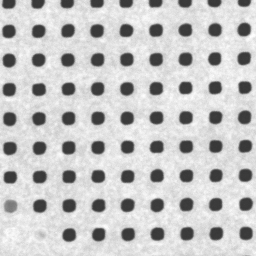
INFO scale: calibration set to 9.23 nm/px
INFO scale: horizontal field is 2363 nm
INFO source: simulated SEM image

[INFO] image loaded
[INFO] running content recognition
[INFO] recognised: a regular array of holes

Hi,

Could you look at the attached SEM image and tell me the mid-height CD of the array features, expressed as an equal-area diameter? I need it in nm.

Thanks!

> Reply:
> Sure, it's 129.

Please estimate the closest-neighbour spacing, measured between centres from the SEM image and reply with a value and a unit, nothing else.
267 nm